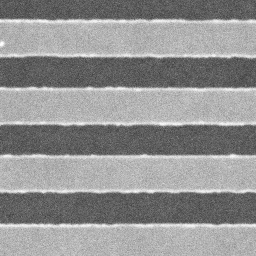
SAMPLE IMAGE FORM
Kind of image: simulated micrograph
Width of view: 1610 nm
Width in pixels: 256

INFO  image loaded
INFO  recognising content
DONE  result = lines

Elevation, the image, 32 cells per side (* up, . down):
................................
................................
................................
********************************
********************************
********************************
********************************
................................
................................
................................
................................
********************************
********************************
********************************
********************************
*......****..****..****....*****
................................
................................
................................
******..*..*.....**.........**..
********************************
********************************
********************************
********************************
................................
................................
................................
................................
********************************
********************************
********************************
********************************